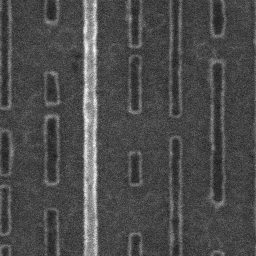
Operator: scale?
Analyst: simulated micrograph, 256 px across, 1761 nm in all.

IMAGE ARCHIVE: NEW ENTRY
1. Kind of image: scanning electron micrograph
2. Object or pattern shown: parallel lines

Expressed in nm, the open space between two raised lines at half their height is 216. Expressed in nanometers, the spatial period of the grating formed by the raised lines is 288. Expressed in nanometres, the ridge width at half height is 72.2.